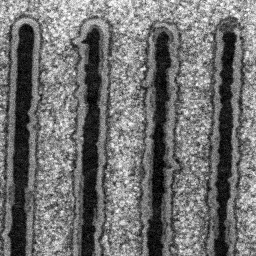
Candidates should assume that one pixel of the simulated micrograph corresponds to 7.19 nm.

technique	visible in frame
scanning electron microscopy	one or a few lines or trenches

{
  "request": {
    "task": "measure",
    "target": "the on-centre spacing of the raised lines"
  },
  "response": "486 nm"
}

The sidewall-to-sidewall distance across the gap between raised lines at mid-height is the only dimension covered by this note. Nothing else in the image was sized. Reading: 329 nm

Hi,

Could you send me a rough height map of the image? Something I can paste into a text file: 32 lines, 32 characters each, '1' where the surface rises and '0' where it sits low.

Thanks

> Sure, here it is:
00000000000000000000000000000000
00000000000000000000000000000000
00000000000000000000000000000000
00111000000110000001100000011100
00111000001110000001110000011100
00111000001110000001110000011100
00111000001110000001110000011100
00110000001110000001110000011100
00111000001110000001110000011100
00110000001110000001110000011100
00110000001110000001110000011100
00110000001110000001110000011100
00110000001110000001110000011000
01110000001110000001100000011100
01110000001110000001100000011000
01110000001110000001100000011000
01110000001110000001100000011000
01110000001110000001100000011000
01110000001110000001100000011000
01110000001110000011100000011100
01110000001110000011110000011000
01110000001110000011100000011000
01110000001100000011100000011000
01110000001100000011100000011000
01110000001110000011100000111000
01110000001110000011100000011000
01110000001110000011100000011000
01110000001110000011100000111000
01110000001100000011100000111000
01110000011100000011100000011000
01110000011100000011100000111000
01110000011100000011100000111000